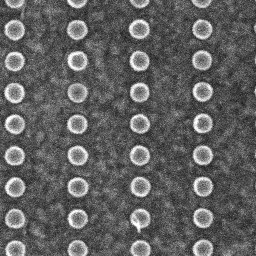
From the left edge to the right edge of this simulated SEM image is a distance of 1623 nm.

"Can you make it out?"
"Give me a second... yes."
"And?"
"a regular array of raised bodies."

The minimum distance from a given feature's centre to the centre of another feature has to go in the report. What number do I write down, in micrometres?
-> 0.198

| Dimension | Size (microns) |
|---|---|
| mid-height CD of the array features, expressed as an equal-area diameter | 0.118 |